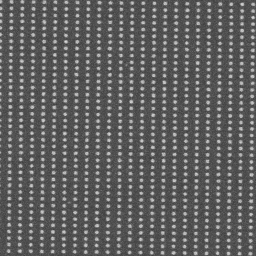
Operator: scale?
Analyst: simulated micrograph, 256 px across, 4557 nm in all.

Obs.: a regular array of raised bodies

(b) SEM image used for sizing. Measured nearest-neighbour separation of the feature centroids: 0.114 micrometres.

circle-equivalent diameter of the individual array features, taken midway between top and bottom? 56.8 nm